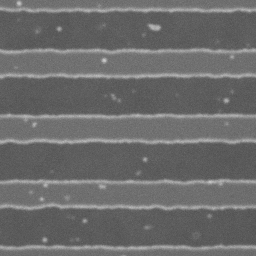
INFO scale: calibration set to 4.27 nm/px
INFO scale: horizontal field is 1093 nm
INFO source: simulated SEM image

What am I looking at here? lines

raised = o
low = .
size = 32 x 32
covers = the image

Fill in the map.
oooooooooooooooooooooooooooooooo
................................
................................
...................o............
................................
................................
oooooooooooooooooooooooooooooooo
oooooooooooooooooooooooooooooooo
oooooooooooooooooooooooooooooooo
o.oooo..oooooooooooo..oo..ooooo.
................................
................................
................................
................................
oooo.oooooooo..ooooooooooooooooo
oooooooooooooooooooooooooooooooo
oooooooooooooooooooooooooooooooo
oooooooooooooooooooooooooooooooo
................................
................................
................................
................................
................................
oooooooooooooooooooooooooooooooo
oooooooooooooooooooooooooooooooo
oooooooooooooooooooooooooooooooo
................................
................................
................................
................................
................................
oooooooooooooooooooooooooooooooo